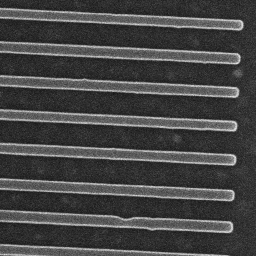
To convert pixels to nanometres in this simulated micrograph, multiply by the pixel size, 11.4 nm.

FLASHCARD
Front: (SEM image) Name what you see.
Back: parallel lines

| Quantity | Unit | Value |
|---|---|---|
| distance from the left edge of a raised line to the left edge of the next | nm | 385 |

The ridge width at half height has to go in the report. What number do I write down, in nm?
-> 112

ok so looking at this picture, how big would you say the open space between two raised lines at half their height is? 0.276 microns